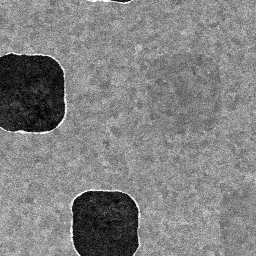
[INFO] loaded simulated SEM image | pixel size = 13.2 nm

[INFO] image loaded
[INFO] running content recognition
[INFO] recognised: holes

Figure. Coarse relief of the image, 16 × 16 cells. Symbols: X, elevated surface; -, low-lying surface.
XXXXXXXXXXXXXXXX
XXXXXXXXXXXXXXXX
XXXXXXXXXXXXXXXX
---XXXXXXXXXXXXX
----XXXXXXXXXXXX
----XXXXXXXXXXXX
----XXXXXXXXXXXX
----XXXXXXXXXXXX
XXXXXXXXXXXXXXXX
XXXXXXXXXXXXXXXX
XXXXXXXXXXXXXXXX
XXXXXXXXXXXXXXXX
XXXXX---XXXXXXXX
XXXXX----XXXXXXX
XXXX-----XXXXXXX
XXXXX----XXXXXXX